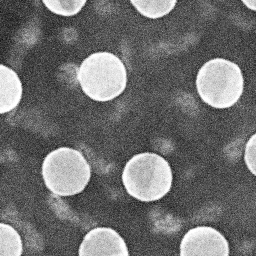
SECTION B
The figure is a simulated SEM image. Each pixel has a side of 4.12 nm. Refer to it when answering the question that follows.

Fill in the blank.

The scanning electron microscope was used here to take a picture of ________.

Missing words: raised bodies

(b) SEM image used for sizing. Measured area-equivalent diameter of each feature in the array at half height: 192 nanometres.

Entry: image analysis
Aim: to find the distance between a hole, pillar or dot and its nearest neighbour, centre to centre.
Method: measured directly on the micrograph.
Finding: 378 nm